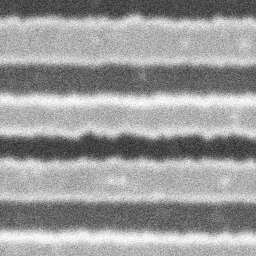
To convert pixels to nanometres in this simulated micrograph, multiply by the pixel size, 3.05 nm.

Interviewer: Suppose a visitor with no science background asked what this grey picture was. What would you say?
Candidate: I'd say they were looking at lines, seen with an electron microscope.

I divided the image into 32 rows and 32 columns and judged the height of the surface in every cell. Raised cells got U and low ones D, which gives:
DDDDDDDDDDDDDDDDDDDDDDDDDDDDDDDD
DDDDDDDDDDDDDDDDDDDDDDDDDDDDDDDD
DUDDDUUDDDDUDDDDUUDDDDDDDDDUDDDD
UUUUUUUUUUUUUUUUUUUUUUUUUUUUUUUU
UUUUUUUUUUUUUUUUUUUUUUUUUUUUUUUU
UUUUUUUUUUUUUUUUUUUUUUUUUUUUUUUU
UUUUUUUUUUUUUUUUUUUUUUUUUUUUUUUU
UUUUUUUUUUUUUUUUUUUUUUUUUUUUUUUU
DDDDDDDDDDDDDDDDDDDDDDDDDDDDDDDD
DDDDDDDDDDDDDDDDDDDDDDDDDDDDDDDD
DDDDDDDDDDDDDDDDDDDDDDDDDDDDDDDD
DDDDDDDDDDDDDDDDDDDDDDDDDDDDDDDD
UUDDUDUDDDDDUUDDDDDDDDDDDDUDDDDD
UUUUUUUUUUUUUUUUUUUUUUUUUUUUUUUU
UUUUUUUUUUUUUUUUUUUUUUUUUUUUUUUU
UUUUUUUUUUUUUUUUUUUUUUUUUUUUUUUU
UUUUUUUUUUUDUUUDUUUUUUUUUUUUUUUU
DDDDDDDDDDDDDDDDDDDDDDDDDDDDDDDD
DDDDDDDDDDDDDDDDDDDDDDDDDDDDDDDD
DDDDDDDDDDDDDDDDDDDDDDDDDDDDDDDD
UUUUUUUUUUUUUUUUUUUUUUUUUUUUUDUU
UUUUUUUUUUUUUUUUUUUUUUUUUUUUUUUU
UUUUUUUUUUUUUUUUUUUUUUUUUUUUUUUU
UUUUUUUUUUUUUUUUUUUUUUUUUUUUUUUU
UUUUUUUUUUUUUUUUUUUUUUUUUUUUUUUU
DDDDDDDDDDDDDDDDDDDDDDDDDDDDDDDD
DDDDDDDDDDDDDDDDDDDDDDDDDDDDDDDD
DDDDDDDDDDDDDDDDDDDDDDDDDDDDDDDD
DDDDDDDDDDDDDDDDDDDDDDDDDDDDDDDD
DDDDDDDDDDUDDUDDDDDDDDDDDDDDDDDD
UUUUUUUUUUUUUUUUUUUUUUUUUUUUUUUU
UUUUUUUUUUUUUUUUUUUUUUUUUUUUUUUU